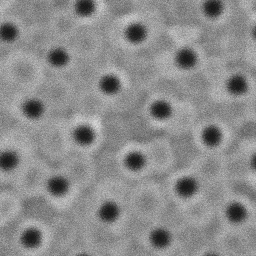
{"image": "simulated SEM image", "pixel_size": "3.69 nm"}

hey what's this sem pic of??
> a regular array of holes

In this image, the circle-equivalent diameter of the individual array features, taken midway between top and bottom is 20.4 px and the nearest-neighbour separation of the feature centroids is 210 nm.